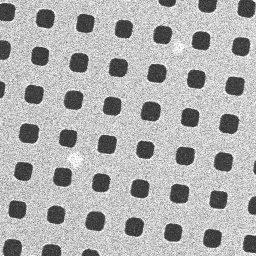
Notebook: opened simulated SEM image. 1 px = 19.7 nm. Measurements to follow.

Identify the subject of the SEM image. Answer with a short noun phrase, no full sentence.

a regular array of holes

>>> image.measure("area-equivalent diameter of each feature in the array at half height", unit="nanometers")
398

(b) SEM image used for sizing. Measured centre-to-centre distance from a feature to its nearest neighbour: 38.5 pixels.